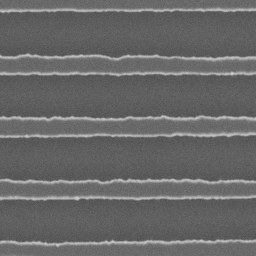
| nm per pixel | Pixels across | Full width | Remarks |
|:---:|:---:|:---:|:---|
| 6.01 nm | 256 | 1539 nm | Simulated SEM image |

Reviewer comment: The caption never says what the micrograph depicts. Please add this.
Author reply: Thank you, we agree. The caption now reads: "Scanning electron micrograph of lines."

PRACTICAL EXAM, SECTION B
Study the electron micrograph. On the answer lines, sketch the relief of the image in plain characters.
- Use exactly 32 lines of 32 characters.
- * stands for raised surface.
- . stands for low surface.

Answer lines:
********************************
**..............................
................................
................................
................................
................................
................................
********************************
********************************
................................
................................
................................
................................
................................
....................*...........
********************************
********************************
................................
................................
................................
................................
................................
*.............*.*...**.*........
********************************
********************************
................................
................................
................................
................................
................................
********************************
********************************